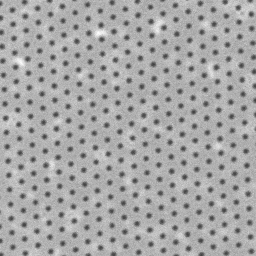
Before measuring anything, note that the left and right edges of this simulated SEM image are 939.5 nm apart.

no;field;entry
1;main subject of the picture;a regular array of holes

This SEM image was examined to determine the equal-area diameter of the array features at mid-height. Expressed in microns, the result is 0.0194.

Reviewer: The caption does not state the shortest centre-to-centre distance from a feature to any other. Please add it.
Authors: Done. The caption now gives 51.7 nm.